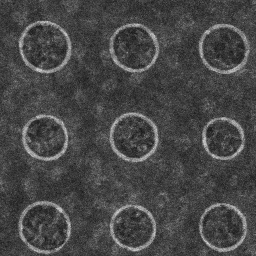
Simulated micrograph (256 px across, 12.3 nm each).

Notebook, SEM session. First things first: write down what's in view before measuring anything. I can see a regular array of raised bodies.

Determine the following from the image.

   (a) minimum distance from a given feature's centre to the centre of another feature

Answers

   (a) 1.09 micrometres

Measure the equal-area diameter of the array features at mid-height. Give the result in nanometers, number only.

571